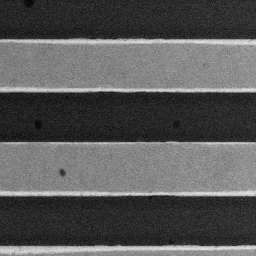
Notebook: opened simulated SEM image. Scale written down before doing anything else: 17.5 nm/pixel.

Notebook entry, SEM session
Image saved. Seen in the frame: lines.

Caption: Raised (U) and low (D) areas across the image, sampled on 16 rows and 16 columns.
DDDDDDDDDDDDDDDD
DDDDDDDDDDDDDDDD
UUUUUUUUUUUUUDDD
UUUUUUUUUUUUUUUU
UUUUUUUUUUUUUUUU
UUUUUUUUUUUUUUUU
DDDDDDDDDDDDDDDD
DDDDDDDDDDDDDDDD
DDDDDDDDDDDDDDDD
UUUUUUUUUUUUUUUU
UUUUUUUUUUUUUUUU
UUUUUUUUUUUUUUUU
DDDDDDDDDDDDDDDD
DDDDDDDDDDDDDDDD
DDDDDDDDDDDDDDDD
UUUUUUUUUUUUUUUU